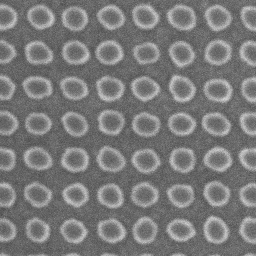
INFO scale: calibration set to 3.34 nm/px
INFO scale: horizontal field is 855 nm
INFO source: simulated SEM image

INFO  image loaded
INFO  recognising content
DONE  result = a regular array of raised bodies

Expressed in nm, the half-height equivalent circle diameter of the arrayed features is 80.4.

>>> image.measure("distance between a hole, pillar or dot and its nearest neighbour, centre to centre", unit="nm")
116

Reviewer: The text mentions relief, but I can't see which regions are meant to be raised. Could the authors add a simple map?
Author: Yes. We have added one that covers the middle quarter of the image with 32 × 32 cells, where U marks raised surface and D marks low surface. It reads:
DDDDDDDDDDDDDDDDDDDDDDDDDDDDDDDD
DDDDDDDDDDDDDDDDDDDDDDDDDDDDDDDD
DDDDDDDDDDDDDDDDDDDDDDDDDDDDDDDD
DUDDDDDDDDUUDDDDDDDUUDDDDDDUUUDD
UUUUUDDDUUUUUUDDDUUUUUUDDDDUUUUU
UUUUUDDDUUUUUUUDDUUUUUUUDDDUUUUU
UUUUUUDDDUUUUUUDDUUUUUUUDDDUUUUU
UUUUUUDDDUUUUUDDDDUUUUUDDDDUUUUU
DDUUDDDDDDUUUDDDDDDUUUDDDDDDUUUU
DDDDDDDDDDDDDDDDDDDDDDDDDDDDDDDD
DDDDDDDDDDDDDDDDDDDDDDDDDDDDDDDD
DDDDDDDDDDDDDDDDDDDDDDDDDDDDDDDD
DUUDDDDDDUUUUUDDDDDUUDDDDDDDUUDD
UUUUUDDDDUUUUUUDDDUUUUUDDDDUUUUU
UUUUUUDDDUUUUUUDDUUUUUUUDDUUUUUU
UUUUUUDDDUUUUUUDDUUUUUUUDDUUUUUU
DUUUUUDDDUUUUUDDDDUUUUUDDDDUUUUU
DDUUUDDDDDDDDDDDDDDUUUUDDDDDUUUD
DDDDDDDDDDDDDDDDDDDDDDDDDDDDDDDD
DDDDDDDDDDDDDDDDDDDDDDDDDDDDDDDD
DDDDDDDDDDDDDDDDDDDDDDDDDDDDDDDD
DUUUUDDDDUUUUDDDDDDDUUDDDDDDUUUD
UUUUUUDDDUUUUUDDDDUUUUUDDDDUUUUU
UUUUUUDDDUUUUUUDDUUUUUUUDDDUUUUU
UUUUUUDDDUUUUUUDDUUUUUUUDDDUUUUU
UUUUUUDDDUUUUUUDDDUUUUUDDDDUUUUU
DDUUUDDDDDUUUUDDDDDUUUDDDDDDDUUD
DDDDDDDDDDDDDDDDDDDDDDDDDDDDDDDD
DDDDDDDDDDDDDDDDDDDDDDDDDDDDDDDD
DDDDDDDDDDDDDDDDDDDDDDDDDDDDDDDD
DDUUUDDDDDUUUDDDDDUUUUDDDDDDUUUD
UUUUUDDDDUUUUUDDDUUUUUUDDDUUUUUU